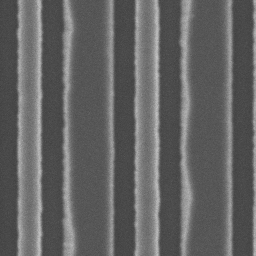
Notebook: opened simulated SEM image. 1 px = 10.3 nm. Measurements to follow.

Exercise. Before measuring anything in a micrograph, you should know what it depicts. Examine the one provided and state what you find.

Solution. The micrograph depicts lines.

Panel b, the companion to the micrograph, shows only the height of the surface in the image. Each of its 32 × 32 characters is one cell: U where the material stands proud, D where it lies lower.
DDUUUDDDUUUUUUDDDUUUDDDUUUUUUDDD
DDUUUDDDUUUUUUDDDUUUDDDUUUUUUDDD
DDUUUDDDUUUUUUDDDUUUDDDUUUUUUDDD
DDUUUDDDUUUUUUDDDUUUDDDUUUUUUDDD
DDUUUDDDUUUUUUDDDUUUDDDUUUUUUDDD
DDUUUDDDUUUUUUDDDUUUDDDUUUUUUDDD
DDUUUDDDUUUUUUDDDUUUDDDUUUUUUDDD
DDUUUDDDUUUUUUDDDUUUDDDUUUUUUDDD
DDUUUDDDUUUUUUDDDUUUDDDUUUUUUDDD
DDUUUDDDUUUUUUDDDUUUDDDUUUUUUDDD
DDUUUDDDUUUUUUDDDUUUDDDUUUUUUDDD
DDUUUDDDUUUUUUDDDUUUDDDUUUUUUDDD
DDUUUDDDUUUUUUDDDUUUDDDUUUUUUDDD
DDUUUDDDUUUUUUDDDUUUDDDUUUUUUDDD
DDUUUDDDUUUUUUDDDUUUDDDUUUUUUDDD
DDUUUDDDUUUUUUDDDUUUDDDUUUUUUDDD
DDUUUDDDUUUUUUDDDUUUDDDUUUUUUDDD
DDUUUDDDUUUUUUDDDUUUDDDUUUUUUDDD
DDUUUDDDUUUUUUDDDUUUDDDUUUUUUDDD
DDUUUDDDUUUUUUDDDUUUDDDUUUUUUDDD
DDUUUDDDUUUUUUDDDUUUDDDUUUUUUDDD
DDUUUDDDUUUUUUDDDUUUDDDUUUUUUDDD
DDUUUDDDUUUUUUDDDUUUDDDUUUUUUDDD
DDUUUDDDUUUUUUDDDUUUDDDUUUUUUDDD
DDUUUDDDUUUUUUDDDUUUDDDUUUUUUDDD
DDUUUDDDUUUUUUDDDUUUDDDUUUUUUDDD
DDUUUDDDUUUUUUDDDUUUDDDUUUUUUDDD
DDUUUDDDUUUUUUDDDUUUDDDUUUUUUDDD
DDUUUDDDUUUUUUDDDUUUDDDUUUUUUDDD
DDUUUDDDUUUUUUDDDUUUDDDUUUUUUDDD
DDUUUDDDUUUUUUDDDUUUDDDUUUUUUDDD
DDUUUDDDUUUUUUDDDUUUDDDUUUUUUDDD